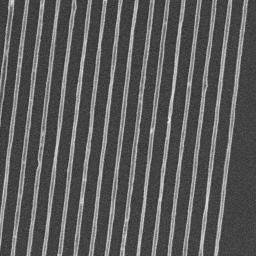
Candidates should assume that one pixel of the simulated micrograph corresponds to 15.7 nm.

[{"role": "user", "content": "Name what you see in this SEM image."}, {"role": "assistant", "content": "parallel lines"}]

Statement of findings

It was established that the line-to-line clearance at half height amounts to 11.8 pixels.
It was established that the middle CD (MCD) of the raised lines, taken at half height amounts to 50.9 nm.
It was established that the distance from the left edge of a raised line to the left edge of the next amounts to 244 nanometers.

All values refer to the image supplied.